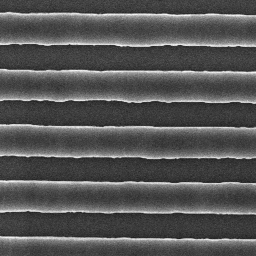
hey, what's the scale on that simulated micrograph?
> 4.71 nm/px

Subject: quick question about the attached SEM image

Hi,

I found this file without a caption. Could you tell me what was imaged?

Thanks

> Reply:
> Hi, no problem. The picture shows lines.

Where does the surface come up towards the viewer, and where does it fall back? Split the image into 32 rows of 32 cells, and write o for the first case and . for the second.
................................
................................
oooooooooooooooooooooooooooooooo
oooooooooooooooooooooooooooooooo
oooooooooooooooooooooooooooooooo
oo..oooooooooooooooooooooooooooo
................................
................................
................................
oooooooooooooooooooooooooooooooo
oooooooooooooooooooooooooooooooo
oooooooooooooooooooooooooooooooo
o.ooooooooo..ooooooooooooooooooo
................................
................................
................................
oooooooooooooooooooooooooooooooo
oooooooooooooooooooooooooooooooo
oooooooooooooooooooooooooooooooo
...o.ooooooooooooooooooooooooooo
................................
................................
................................
oooooooooooooooooooooooooooooooo
oooooooooooooooooooooooooooooooo
oooooooooooooooooooooooooooooooo
o....ooooooooooooooooooooooooooo
................................
................................
................................
oooooooooooooooooooooooooooooooo
oooooooooooooooooooooooooooooooo